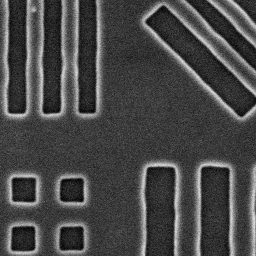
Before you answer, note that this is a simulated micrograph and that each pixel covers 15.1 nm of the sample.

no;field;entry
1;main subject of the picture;groups of lines, slits or small figures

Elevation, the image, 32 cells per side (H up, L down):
HLLHHLLLHHLLHHHHHHHHHHHHLLLHHLLL
HLLHHLLLHHLLHHHHHHHLLHHHHLLLHHLL
HLLHHLLLHHLLHHHHHHLLLLLHHLLLLHHL
HLLHHLLLHHLLHHHHHHHLLLLLHHLLLLHH
HLLLHLLLHHLLHHHHHHHHLLLLLHHLLLLH
HLLLHLLLHHLLHHHHHHHHHLLLLLHHLLLL
HLLLHLLLHHLLHHHHHHHHHHLLLLLHHLLL
HLLHHLLLHHLLHHHHHHHHHHHLLLLHHHHL
HLLHHLLLHHLLHHHHHHHHHHHHLLLLLHHH
HLLHHLLLHHLLHHHHHHHHHHHHHLLLLLHH
HLLHHLLLHHLLHHHHHHHHHHHHHHLLLLLH
HLLHHLLLHHLLHHHHHHHHHHHHHHHLLLLH
HLLHHLLLHHLLHHHHHHHHHHHHHHHHLLLL
HLLHHLLLHHLLHHHHHHHHHHHHHHHHHLLL
HHHHHHHHHHHHHHHHHHHHHHHHHHHHHHLH
HHHHHHHHHHHHHHHHHHHHHHHHHHHHHHHH
HHHHHHHHHHHHHHHHHHHHHHHHHHHHHHHH
HHHHHHHHHHHHHHHHHHHHHHHHHHHHHHHH
HHHHHHHHHHHHHHHHHHHHHHHHHHHHHHHH
HHHHHHHHHHHHHHHHHHHHHHHHHHHHHHHH
HHHHHHHHHHHHHHHHHHHHHHHHHHHHHHHH
HHHHHHHHHHHHHHHHHHLLLLHHHLLLLHHH
HLLLLHHHLLHHHHHHHHLLLLHHHLLLLHHH
HLLLLHHLLLLHHHHHHHLLLLHHHLLLLHHH
HLLLLHHLLLLHHHHHHHLLLLHHHLLLLHHH
HHHHHHHHHHHHHHHHHHLLLLHHHLLLLHHH
HHHHHHHHHHHHHHHHHHLLLLHHHLLLLHHH
HHHHHHHHHHHHHHHHHHLLLLHHHLLLLHHH
HHLLHHHHLLHHHHHHHHLLLLHHHLLLLHHH
HLLLLHHLLLLHHHHHHHLLLLHHHLLLLHHH
HLLLLHHLLLLHHHHHHHLLLLHHHLLLLHHH
HHLLHHHHHHHHHHHHHHLLLLHHHLLLLHHH